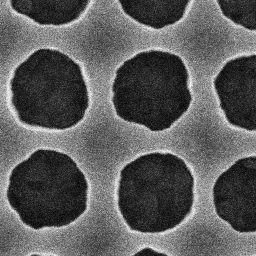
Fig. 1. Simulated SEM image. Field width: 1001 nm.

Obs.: holes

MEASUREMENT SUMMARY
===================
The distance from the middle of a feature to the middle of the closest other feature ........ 0.395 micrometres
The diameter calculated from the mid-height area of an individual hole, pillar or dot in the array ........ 80.3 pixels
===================